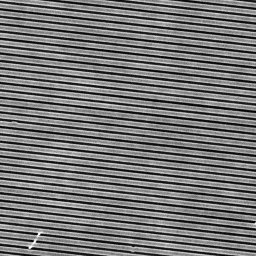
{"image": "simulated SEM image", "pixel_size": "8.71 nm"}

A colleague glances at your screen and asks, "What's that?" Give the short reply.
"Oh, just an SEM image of parallel lines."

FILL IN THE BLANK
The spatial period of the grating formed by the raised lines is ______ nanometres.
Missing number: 63.7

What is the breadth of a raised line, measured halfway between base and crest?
4.35 px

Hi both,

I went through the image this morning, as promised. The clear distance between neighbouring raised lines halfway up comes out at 2.61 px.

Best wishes